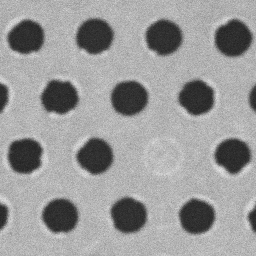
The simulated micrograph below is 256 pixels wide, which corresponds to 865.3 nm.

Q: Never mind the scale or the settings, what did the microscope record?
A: a regular array of holes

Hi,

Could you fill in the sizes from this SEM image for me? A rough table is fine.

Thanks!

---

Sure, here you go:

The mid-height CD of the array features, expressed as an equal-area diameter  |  119 nanometres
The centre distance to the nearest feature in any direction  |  0.231 micrometres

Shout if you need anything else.